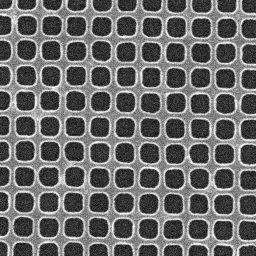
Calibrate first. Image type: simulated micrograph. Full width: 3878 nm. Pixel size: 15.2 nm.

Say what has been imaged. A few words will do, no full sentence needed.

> a regular array of holes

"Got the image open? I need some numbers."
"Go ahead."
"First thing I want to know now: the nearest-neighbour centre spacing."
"373 nanometers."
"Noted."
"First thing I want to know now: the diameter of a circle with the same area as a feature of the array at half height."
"319 nm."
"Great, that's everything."